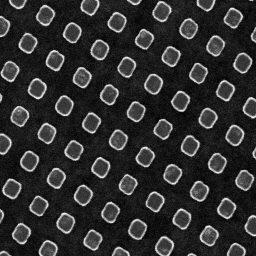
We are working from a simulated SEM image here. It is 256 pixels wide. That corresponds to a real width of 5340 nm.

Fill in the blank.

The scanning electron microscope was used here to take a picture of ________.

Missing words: a regular array of raised bodies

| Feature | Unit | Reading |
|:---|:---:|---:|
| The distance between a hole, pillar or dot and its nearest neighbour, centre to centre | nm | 666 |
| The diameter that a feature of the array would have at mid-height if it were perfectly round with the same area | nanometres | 364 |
